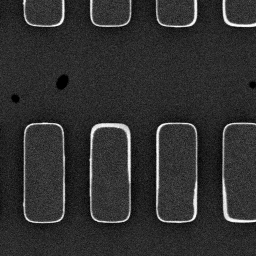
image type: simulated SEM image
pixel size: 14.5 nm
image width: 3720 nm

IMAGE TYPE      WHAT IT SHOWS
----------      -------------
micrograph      groups of lines, slits or small figures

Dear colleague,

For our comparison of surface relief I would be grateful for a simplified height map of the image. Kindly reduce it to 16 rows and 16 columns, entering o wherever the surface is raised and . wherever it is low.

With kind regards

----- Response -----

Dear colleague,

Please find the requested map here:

..oo..oo..oo..oo
..oo..oo..oo...o
................
................
................
................
................
................
..oo..oo..oo..oo
..oo..oo..oo..oo
..oo..oo..oo..oo
..oo..oo..oo..oo
..oo..oo..oo..oo
..oo..oo..oo..oo
................
................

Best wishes